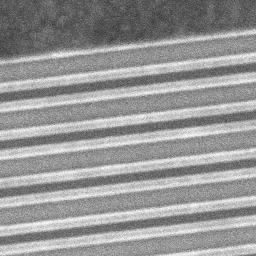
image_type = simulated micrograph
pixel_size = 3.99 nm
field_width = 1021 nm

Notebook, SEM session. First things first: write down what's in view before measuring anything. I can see parallel lines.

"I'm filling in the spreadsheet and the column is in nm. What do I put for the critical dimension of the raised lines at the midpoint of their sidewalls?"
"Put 31.2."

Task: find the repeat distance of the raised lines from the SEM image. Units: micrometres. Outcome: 0.0922